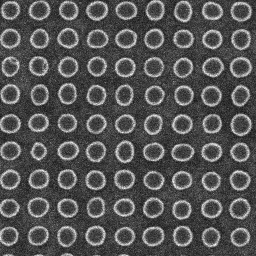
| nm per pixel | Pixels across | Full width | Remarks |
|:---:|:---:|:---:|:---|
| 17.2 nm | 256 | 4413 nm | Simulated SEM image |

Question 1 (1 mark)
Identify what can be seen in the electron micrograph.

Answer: a regular array of raised bodies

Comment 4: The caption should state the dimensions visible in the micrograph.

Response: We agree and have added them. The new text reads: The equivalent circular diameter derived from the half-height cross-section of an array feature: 316 nanometers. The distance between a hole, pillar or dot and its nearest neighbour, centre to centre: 478 nanometers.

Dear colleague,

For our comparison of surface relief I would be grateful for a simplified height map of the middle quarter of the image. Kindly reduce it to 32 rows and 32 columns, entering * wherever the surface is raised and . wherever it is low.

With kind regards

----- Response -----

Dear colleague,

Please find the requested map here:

***...****...*****..*****...****
***...****...*****..*****...****
**.....**.....***....***....***.
................................
................................
**............**................
***...****...****....***....****
***...****...****....****...****
***...****...****....****...****
**.....***....**.....***....***.
................................
................................
................................
***....***....***....***....***.
***...****...*****..****...*****
***...****...****...****...*****
**....****...****....***....***.
................................
................................
................................
***...****....***....***....***.
***...****...****...*****..*****
***...****...****...*****..*****
**....****....***....***....***.
................................
................................
................................
***...***....****....***....***.
***...****...****...*****..*****
***...****...****...*****..*****
**....****....***....***....***.
................................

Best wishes